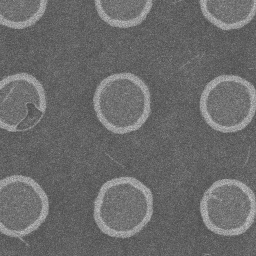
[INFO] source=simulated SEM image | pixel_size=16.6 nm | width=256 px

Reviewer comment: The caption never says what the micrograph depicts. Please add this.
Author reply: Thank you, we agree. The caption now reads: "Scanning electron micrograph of raised bodies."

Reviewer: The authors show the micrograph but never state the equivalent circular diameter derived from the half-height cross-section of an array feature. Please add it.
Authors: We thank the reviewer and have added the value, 874 nm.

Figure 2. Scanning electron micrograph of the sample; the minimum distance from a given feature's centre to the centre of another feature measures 1.73 µm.